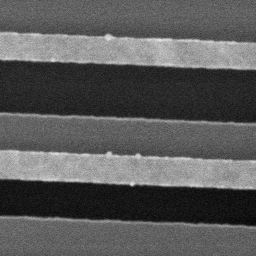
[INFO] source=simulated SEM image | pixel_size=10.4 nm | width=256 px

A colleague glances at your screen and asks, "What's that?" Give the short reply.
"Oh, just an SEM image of lines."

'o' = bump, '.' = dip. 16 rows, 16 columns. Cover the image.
oooooooooooooooo
oooooooooooooooo
oooooooooooooooo
oooooooooooooooo
................
................
................
oooooooooo......
oooooooooooooooo
oooooooooooooooo
oooooooooooooooo
........oooooooo
................
................
oooooooooooooooo
oooooooooooooooo